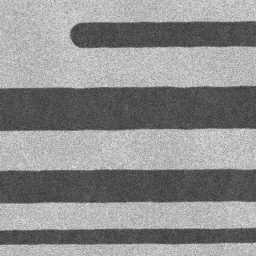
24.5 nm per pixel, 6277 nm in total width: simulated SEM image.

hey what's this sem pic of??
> groups of lines, slits or small figures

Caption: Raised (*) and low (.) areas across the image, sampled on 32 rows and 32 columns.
********************************
********************************
********************************
*********.......................
*********.......................
*********.......................
********************************
********************************
********************************
********************************
********************************
................................
................................
................................
................................
................................
..**********.*******************
********************************
********************************
********************************
********************************
................................
................................
................................
................................
.....*.***.*********************
********************************
********************************
*************....*........*.....
................................
............................****
********************************